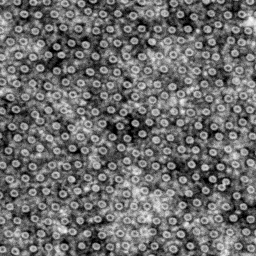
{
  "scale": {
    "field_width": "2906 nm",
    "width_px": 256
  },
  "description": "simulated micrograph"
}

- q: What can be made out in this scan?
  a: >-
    a regular array of raised bodies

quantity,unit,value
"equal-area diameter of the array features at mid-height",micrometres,0.0789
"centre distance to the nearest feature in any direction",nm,151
